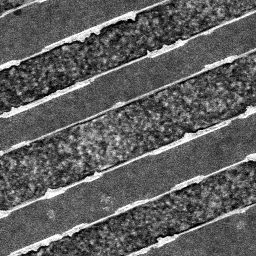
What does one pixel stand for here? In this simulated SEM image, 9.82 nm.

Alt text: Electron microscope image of one or a few lines or trenches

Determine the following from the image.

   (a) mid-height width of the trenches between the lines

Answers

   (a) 440 nm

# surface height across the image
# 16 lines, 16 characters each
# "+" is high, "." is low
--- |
.++++++++.......
+++++++.......++
+++++.......++++
++.......++++++.
.......+++++....
....++++++......
..++++++........
+++++.........++
+++.........++++
..........++++++
.......+++++++..
.....+++++++....
..+++++++.......
+++++++.......++
+++++.......++++
++.......+++++++